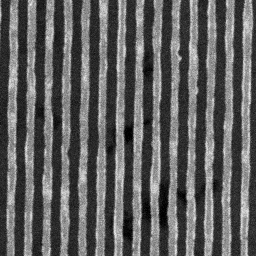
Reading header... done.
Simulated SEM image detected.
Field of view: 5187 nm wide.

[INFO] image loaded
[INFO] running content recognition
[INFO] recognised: parallel lines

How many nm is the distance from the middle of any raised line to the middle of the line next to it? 364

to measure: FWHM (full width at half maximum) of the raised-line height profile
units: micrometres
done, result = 0.137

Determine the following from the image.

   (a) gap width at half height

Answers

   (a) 225 nm